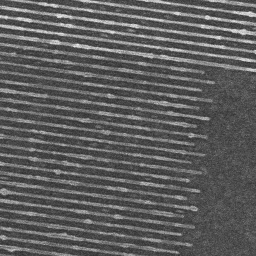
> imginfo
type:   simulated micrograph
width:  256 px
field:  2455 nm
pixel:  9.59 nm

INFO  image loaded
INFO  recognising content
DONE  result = parallel lines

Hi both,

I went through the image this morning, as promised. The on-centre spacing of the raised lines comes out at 9.11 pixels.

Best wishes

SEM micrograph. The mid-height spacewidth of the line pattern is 64.1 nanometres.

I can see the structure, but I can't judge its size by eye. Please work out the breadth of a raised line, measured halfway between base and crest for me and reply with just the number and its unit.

0.0286 micrometres